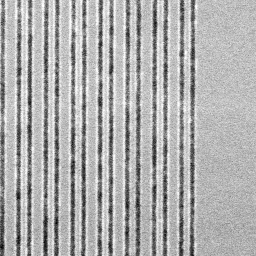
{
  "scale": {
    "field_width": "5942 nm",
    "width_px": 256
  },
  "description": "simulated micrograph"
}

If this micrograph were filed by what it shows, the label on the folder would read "parallel lines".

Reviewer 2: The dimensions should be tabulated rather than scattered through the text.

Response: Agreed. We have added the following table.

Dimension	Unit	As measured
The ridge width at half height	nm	142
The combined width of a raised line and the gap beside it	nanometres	310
